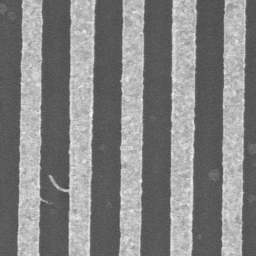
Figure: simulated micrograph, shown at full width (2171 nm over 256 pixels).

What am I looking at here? lines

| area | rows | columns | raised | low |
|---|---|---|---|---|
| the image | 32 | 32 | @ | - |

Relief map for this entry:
---@@----@@@---@@@----@@----@@@-
---@@----@@@---@@@----@@----@@@-
---@@----@@@---@@@----@@----@@@-
---@@----@@@---@@@----@@----@@@-
---@@----@@@---@@@----@@----@@@-
---@@----@@@---@@@----@@----@@@-
---@@----@@@---@@@----@@----@@@-
---@@----@@@---@@@----@@----@@@-
---@@----@@@---@@@----@@----@@@-
---@@----@@@---@@@----@@----@@--
---@@----@@@---@@@----@@----@@--
---@@----@@@---@@@----@@----@@--
---@@----@@@---@@@----@@----@@--
---@@----@@@---@@@----@@----@@--
---@@----@@----@@@---@@@----@@--
---@@----@@----@@@---@@@----@@--
---@@----@@----@@@---@@@----@@--
---@@----@@----@@@---@@@----@@--
--@@@----@@----@@@---@@@----@@--
---@@----@@----@@@---@@@----@@--
--@@@----@@----@@@---@@@----@@--
--@@@----@@----@@@---@@@----@@--
--@@@----@@----@@@---@@@----@@--
--@@@----@@----@@@---@@@----@@--
--@@@----@@----@@@---@@@----@@--
--@@@----@@----@@@---@@@----@@--
--@@@----@@----@@@---@@@----@@--
--@@@----@@----@@@---@@@----@@--
--@@@----@@----@@@---@@@----@@--
--@@@----@@----@@@---@@@----@@--
--@@@----@@----@@----@@@----@@--
--@@@----@@----@@----@@@----@@--